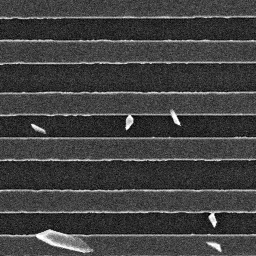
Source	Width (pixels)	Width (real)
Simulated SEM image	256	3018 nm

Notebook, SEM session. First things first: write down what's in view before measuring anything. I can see lines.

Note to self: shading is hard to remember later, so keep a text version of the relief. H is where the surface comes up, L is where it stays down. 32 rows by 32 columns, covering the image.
HHHHHHHHHHHHHHHHHHHHHHHHHHHHHHHH
HHHHHHHHHHHHHHHHHHHHHHHHHHHHHHHH
LLLLLLLLLLLLLLLLLLLLLLLLLLLLLLLL
LLLLLLLLLLLLLLLLLLLLLLLLLLLLLLLL
LLLLLLLLLLLLLLLLLLLLLLLLLLLLLLLL
HHHHHHHHHHHHHHHHHHHHHHHHHHHHHHHH
HHHHHHHHHHHHHHHHHHHHHHHHHHHHHHHH
HHHHHHHHHHHHHHHHHHHHHHHHHHHHHHHH
LLLLLLLLLLLLLLLLLLLLLLLLLLLLLLLL
LLLLLLLLLLLLLLLLLLLLLLLLLLLLLLLL
LLLLLLLLLLLLLLLLLLLLLLLLLLLLLLLL
LLLLLLLLLLLLLLLLLLLLLLLLLLLLLLLL
HHHHHHHHHHHHHHHHHHHHHHHHHHHHHHHH
HHHHHHHHHHHHHHHHHHHHHHHHHHHHHHHH
LLLLLLLLLLLLLLLLHLLLLHLLLLLLLLLL
LLLLLLLLLLLLLLLLLLLLLLLLLLLLLLLL
LLLLLLLLLLLLLLLLLLLLLLLLLLLLLLLL
HHHHHHHHHHHHHHHHHHHHHHHHHHHHHHHH
HHHHHHHHHHHHHHHHHHHHHHHHHHHHHHHH
HHHHHHHHHHHHHHHHHHHHHHHHHHHHHHHH
LLLLLLLLLLLLLLLLLLLLLLLLLLLLLLLL
LLLLLLLLLLLLLLLLLLLLLLLLLLLLLLLL
LLLLLLLLLLLLLLLLLLLLLLLLLLLLLLLL
LLLLLLLLLLLLLLLLLLLLLLLLLLLLLLLL
HHHHHHHHHHHHHHHHHHHHHHHHHHHHHHHH
HHHHHHHHHHHHHHHHHHHHHHHHHHHHHHHH
HHHHHHHHHHHHHHHHHHHLHHHHHHHHHHHH
LLLLLLLLLLLLLLLLLLLLLLLLLLHLLLLL
LLLLLLLLLLLLLLLLLLLLLLLLLLLLLLLL
HHHHHHHHHHHHHHHHHHHHHHHHHHHHHHHH
HHHHHHHHHHHHHHHHHHHHHHHHHHHHHHHH
HHHHHHHHHHHHHHHHHHHHHHHHHHHHHHHH